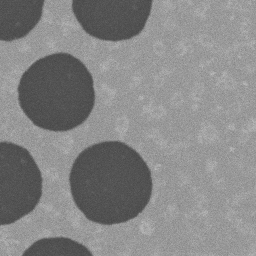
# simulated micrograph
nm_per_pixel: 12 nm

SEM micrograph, holes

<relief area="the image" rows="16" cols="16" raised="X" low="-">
---XX----XXXXXXX
--XXX----XXXXXXX
-XXXXX--XXXXXXXX
XXX--XXXXXXXXXXX
XX----XXXXXXXXXX
X-----XXXXXXXXXX
X-----XXXXXXXXXX
XX---XXXXXXXXXXX
XXXXXXXXXXXXXXXX
--XXX---XXXXXXXX
--XXX----XXXXXXX
---X-----XXXXXXX
--XXX----XXXXXXX
--XXX----XXXXXXX
XXXXXXXXXXXXXXXX
XX---XXXXXXXXXXX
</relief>